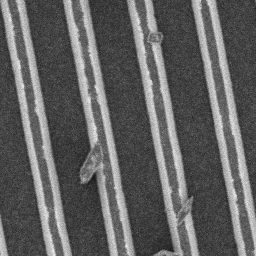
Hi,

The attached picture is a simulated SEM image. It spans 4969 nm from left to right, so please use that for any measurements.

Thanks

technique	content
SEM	parallel lines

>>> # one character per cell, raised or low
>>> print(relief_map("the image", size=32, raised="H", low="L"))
LHHLLLLLHHHLLLLLHHHLLLLLLHLLLLLL
LHHLLLLLLHHLLLLLLHHLLLLLLHHLLLLL
LHHLLLLLLHHLLLLLLHHLLLLLLHHLLLLL
LHHLLLLLLHHLLLLLLHHLLLLLLHHLLLLL
LHHLLLLLLHHLLLLLLHHHLLLLLHHLLLLL
LHHHLLLLLHHLLLLLLHHHLLLLLHHLLLLL
LLHHLLLLLLHHLLLLLLHHLLLLLLHHLLLL
LLHHLLLLLLHHLLLLLLHHLLLLLLHHLLLL
LLHHLLLLLLHHLLLLLLHHLLLLLLHHLLLL
LLHHLLLLLLHHLLLLLLHHLLLLLLHHLLLL
LLHHHLLLLLHHLLLLLLHHLLLLLLHHLLLL
LLLHHLLLLLLHHLLLLLLHHLLLLLLHHLLL
LLLHHLLLLLLHHLLLLLLHHLLLLLLHHLLL
LLLHHLLLLLLHHLLLLLLHHLLLLLLHHLLL
LLLHHLLLLLLHHLLLLLLHHLLLLLLHHLLL
LLLHHLLLLLLHHLLLLLLHHLLLLLLHHLLL
LLLHHHLLLLLLHHLLLLLHHLLLLLLHHHLL
LLLLHHLLLLLLHHLLLLLLHHLLLLLLHHLL
LLLLHHLLLLLLHHLLLLLLHHLLLLLLHHLL
LLLLHHLLLLLHHHLLLLLLHHLLLLLLHHLL
LLLLHHLLLLLHHHLLLLLLHHLLLLLLHHLL
LLLLHHLLLLHHHHLLLLLLHHLLLLLLHHHL
LLLLLHHLLLHLLHHLLLLLLHHLLLLLLHHL
LLLLLHHLLLLLLHHLLLLLLHHLLLLLLHHL
LLLLLHHLLLLLLHHLLLLLLHHLLLLLLHHL
LLLLLHHLLLLLLHHLLLLLLHHHLLLLLHHL
LLLLLHHLLLLLLHHLLLLLLHHHLLLLLHHL
LLLLLLHHLLLLLLHHLLLLLHHHLLLLLHHH
LLLLLLHHLLLLLLHHLLLLLLHHLLLLLLHH
LLLLLLHHLLLLLLHHLLLLLLHHLLLLLLHH
LLLLLLHHLLLLLLHHLLLLLLHHLLLLLLHH
LLLLLLHHLLLLLLHHLLLLHLHHLLLLLLHH